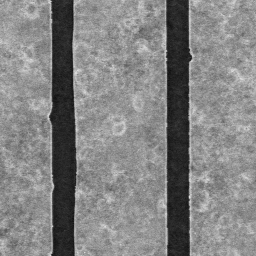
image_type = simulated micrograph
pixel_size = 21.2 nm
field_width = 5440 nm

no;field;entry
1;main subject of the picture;one or a few lines or trenches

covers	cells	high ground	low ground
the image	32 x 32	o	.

oooooo...oooooooooooo...oooooooo
oooooo...oooooooooooo...oooooooo
oooooo...oooooooooooo...oooooooo
oooooo...oooooooooooo...oooooooo
oooooo...oooooooooooo...oooooooo
oooooo...oooooooooooo...oooooooo
oooooo...oooooooooooo...oooooooo
oooooo...oooooooooooo...oooooooo
oooooo...oooooooooooo...oooooooo
oooooo...oooooooooooo...oooooooo
oooooo...oooooooooooo...oooooooo
oooooo...oooooooooooo...oooooooo
oooooo...oooooooooooo...oooooooo
oooooo...oooooooooooo...oooooooo
oooooo...oooooooooooo...oooooooo
oooooo....ooooooooooo...oooooooo
oooooo....ooooooooooo...oooooooo
oooooo....ooooooooooo...oooooooo
oooooo....ooooooooooo...oooooooo
oooooo....ooooooooooo...oooooooo
oooooo....ooooooooooo...oooooooo
oooooo....ooooooooooo...oooooooo
oooooo....ooooooooooo...oooooooo
ooooooo...ooooooooooo...oooooooo
oooooo...oooooooooooo...oooooooo
oooooo...oooooooooooo...oooooooo
oooooo...oooooooooooo...oooooooo
oooooo...oooooooooooo...oooooooo
oooooo...oooooooooooo...oooooooo
oooooo...oooooooooooo...oooooooo
oooooo...oooooooooooo...oooooooo
oooooo...oooooooooooo...oooooooo